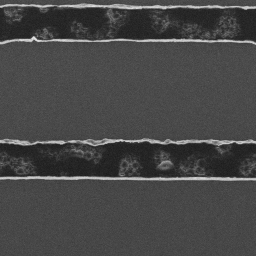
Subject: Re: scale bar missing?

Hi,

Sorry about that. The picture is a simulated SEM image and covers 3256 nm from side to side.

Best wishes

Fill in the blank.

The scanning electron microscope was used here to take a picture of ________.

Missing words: one or a few lines or trenches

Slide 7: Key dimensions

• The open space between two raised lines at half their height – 1.27 µm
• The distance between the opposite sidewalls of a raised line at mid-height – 0.461 µm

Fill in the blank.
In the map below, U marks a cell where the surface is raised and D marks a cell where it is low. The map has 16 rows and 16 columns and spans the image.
UUUUUUUUUUUUUUUU
UUUUUUUUUUUUUUUU
UUUUUUUDUUUUUUUU
DDDDDDDDDDDDDDDD
DDDDDDDDDDDDDDDD
DDDDDDDDDDDDDDDD
DDDDDDDDDDDDDDDD
DDDDDDDDDDDDDDDD
DDDDDDDDDDDDDDDD
UUUUUUUUUUUUUUUU
UUUUUUUUUUUUUUUU
DDDDDDDDDDDDDDDD
DDDDDDDDDDDDDDDD
DDDDDDDDDDDDDDDD
DDDDDDDDDDDDDDDD
DDDDDDDDDDDDDDDD